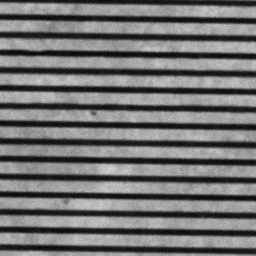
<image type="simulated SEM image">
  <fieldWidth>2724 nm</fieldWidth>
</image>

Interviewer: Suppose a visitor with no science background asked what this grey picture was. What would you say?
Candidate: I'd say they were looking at parallel lines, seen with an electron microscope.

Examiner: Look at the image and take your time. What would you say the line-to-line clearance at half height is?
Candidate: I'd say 70.5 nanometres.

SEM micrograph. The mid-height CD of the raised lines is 11.5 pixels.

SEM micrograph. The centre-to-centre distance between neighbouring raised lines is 188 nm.